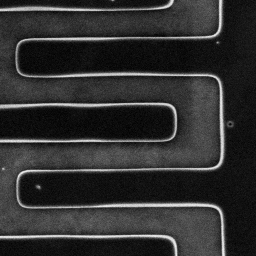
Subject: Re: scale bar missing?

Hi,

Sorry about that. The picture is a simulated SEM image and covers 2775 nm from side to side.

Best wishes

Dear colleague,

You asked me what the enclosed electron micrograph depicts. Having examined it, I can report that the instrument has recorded groups of lines, slits or small figures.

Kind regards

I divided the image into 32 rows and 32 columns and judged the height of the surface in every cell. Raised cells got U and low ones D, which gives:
UUUUUUUUUUUUUUUUUUUUUDDDDDDDUUUU
DDDDDDDDDDDDDDDDDDDDDDDDDDDDUUUU
DDDDDDDDDDDDDDDDDDDDDDDDDDDDUUUU
DDDDDDDDDDDDDDDDDDDDDDDDDDDUUUUU
DDDDDDDDDDDDDDDDDDDDDDDDDDUUUUUU
DDUUUUUUUUUUUUUUUUUUUUUUUUUUUUUU
DDUUUUUUUUUUUUUUUUUUUUUUUUUUUUUU
DDUUUUUUUUUUUUUUUUUUUUUUUUUUUUUU
DDUUUUUUUUUUUUUUUUUUUUUUUUUUUUUU
DDDUUUUUDDDDDDDDDDDDDDDDDDUUUUUU
DDDDDDDDDDDDDDDDDDDDDDDDDDDUUUUU
DDDDDDDDDDDDDDDDDDDDDDDDDDDDUUUU
DDDDDDDDDDDDDDDDDDDDDDDDDDDDUUUU
UUUUUUUUUUUUUUUUUUUUUUDDDDDDUUUU
UUUUUUUUUUUUUUUUUUUUUUDDDDDDUUUU
UUUUUUUUUUUUUUUUUUUUUUDDDDDDUUUU
UUUUUUUUUUUUUUUUUUUUUUDDDDDDUUUU
UUUUUUUUUUUUUUUUUUUUUDDDDDDDUUUU
DDDDDDDDDDDDDDDDDDDDDDDDDDDDUUUU
DDDDDDDDDDDDDDDDDDDDDDDDDDDDUUUU
DDDDDDDDDDDDDDDDDDDDDDDDDDDUUUUU
DDDUUUUUUUUUUUUUUUUUUUUUUUUUUUUU
DDUUUUUUUUUUUUUUUUUUUUUUUUUUUUUU
DDUUUUUUUUUUUUUUUUUUUUUUUUUUUUUU
DDUUUUUUUUUUUUUUUUUUUUUUUUUUUUUU
DDDUUUUUUUUUUUUUUUUUUUUUUUUUUUUU
DDDDDDDDDDDDDDDDDDDDDDDDDDDUUUUU
DDDDDDDDDDDDDDDDDDDDDDDDDDDDUUUU
DDDDDDDDDDDDDDDDDDDDDDDDDDDDUUUU
DDDDDDDDDDDDDDDDUUUUDDDDDDDDUUUU
UUUUUUUUUUUUUUUUUUUUUUDDDDDDUUUU
UUUUUUUUUUUUUUUUUUUUUUDDDDDDUUUU